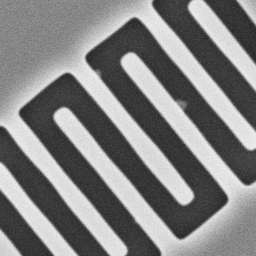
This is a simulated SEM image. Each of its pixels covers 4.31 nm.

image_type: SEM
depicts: groups of lines, slits or small figures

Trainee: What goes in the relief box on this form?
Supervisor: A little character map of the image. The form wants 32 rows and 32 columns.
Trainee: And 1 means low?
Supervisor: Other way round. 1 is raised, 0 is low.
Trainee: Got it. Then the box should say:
11111111111111111110000011000011
11111111111111111110000011100001
11111111111111110011000001100000
11111111111111100001100001110000
11111111111111000001110000111000
11111111111100000000111000011100
11111111111000000000011100001110
11111111111000011100001100000110
11111111111000011100000110000011
11111110011100001110000111000011
11111100001110000111000011100001
11111000000111000011100001110000
11110000000011100001110000111000
11100000000001100000110000011000
11000001100000110000111000001100
11100001110000111000011100001110
01110000111000011100001110000111
00111000011100001110000111000011
00011100001110000111000011000001
00011100000110000111100001100000
00001110000111000011100001110000
10000111000011100001110000111000
11000011100001110000111000011100
11100001110000111000011100001111
01100000110000011100001100001111
00110000111000011100000000001111
00111000011100001110000000011111
00011100001110000111000000111111
00001110000111000011100001111111
10000111000011100001110011111111
10000011000001100001111111111111
11000011100001110000111111111111